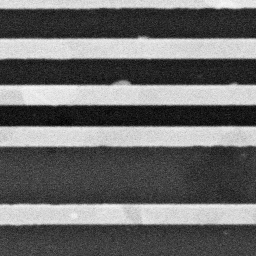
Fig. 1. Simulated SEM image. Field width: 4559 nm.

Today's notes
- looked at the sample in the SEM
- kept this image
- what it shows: lines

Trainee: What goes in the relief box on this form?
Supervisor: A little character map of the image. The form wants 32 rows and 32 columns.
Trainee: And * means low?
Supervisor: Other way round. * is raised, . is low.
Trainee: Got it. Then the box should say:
********************************
................................
................................
................................
................................
********************************
********************************
................................
................................
................................
................................
********************************
********************************
................................
................................
................................
********************************
********************************
................................
................................
................................
................................
................................
................................
................................
................................
********************************
********************************
................................
................................
................................
................................